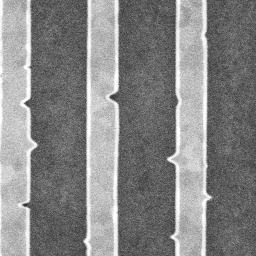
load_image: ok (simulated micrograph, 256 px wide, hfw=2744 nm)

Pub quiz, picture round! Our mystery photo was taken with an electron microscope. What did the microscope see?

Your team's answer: one or a few lines or trenches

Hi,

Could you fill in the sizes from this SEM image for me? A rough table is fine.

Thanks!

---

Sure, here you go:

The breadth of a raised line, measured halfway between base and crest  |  303 nm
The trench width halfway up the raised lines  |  653 nm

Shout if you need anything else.